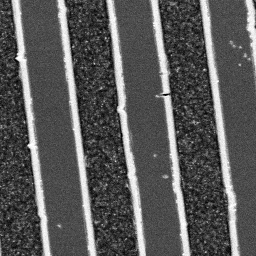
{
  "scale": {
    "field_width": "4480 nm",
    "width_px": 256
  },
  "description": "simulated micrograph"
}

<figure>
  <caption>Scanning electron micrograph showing one or a few lines or trenches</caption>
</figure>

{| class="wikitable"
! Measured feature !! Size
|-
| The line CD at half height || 779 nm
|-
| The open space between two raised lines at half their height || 866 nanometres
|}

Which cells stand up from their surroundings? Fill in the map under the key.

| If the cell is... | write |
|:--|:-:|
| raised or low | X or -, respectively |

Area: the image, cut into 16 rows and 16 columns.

-XXX---XXX---XXX
-XXX---XXX---XXX
-XXX---XXX---XXX
-XXX---XXX---XXX
--XX---XXX---XXX
--XX----XX---XXX
--XXX---XXX---XX
--XXX---XXX---XX
--XXX---XXX---XX
--XXX---XXX---XX
--XXX---XXX---XX
--XXX---XXX---XX
---XX----XX---XX
---XX----XX----X
---XXX---XX----X
---XXX---XXX---X